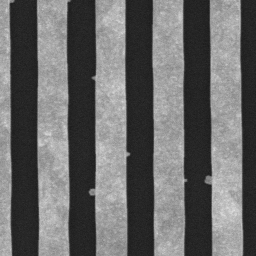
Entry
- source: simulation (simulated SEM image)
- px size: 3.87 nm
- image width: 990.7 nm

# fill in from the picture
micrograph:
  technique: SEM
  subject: wiring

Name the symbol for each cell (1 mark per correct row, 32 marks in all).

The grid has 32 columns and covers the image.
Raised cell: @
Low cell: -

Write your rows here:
@----@@@----@@@@---@@@@---@@@@--
@----@@@----@@@@---@@@@---@@@@--
@----@@@----@@@@---@@@@---@@@@--
@----@@@----@@@@---@@@@---@@@@--
@----@@@----@@@@---@@@@---@@@@--
@----@@@----@@@@---@@@@---@@@@--
@----@@@----@@@@---@@@@---@@@@--
@----@@@----@@@@---@@@@---@@@@--
@----@@@----@@@@---@@@@---@@@@--
@----@@@----@@@@---@@@@---@@@@--
@----@@@----@@@@---@@@@---@@@@--
@----@@@----@@@@---@@@@---@@@@--
@----@@@----@@@@---@@@@---@@@@--
@----@@@----@@@@---@@@@---@@@@--
@----@@@----@@@@---@@@@---@@@@--
@----@@@----@@@@---@@@@---@@@@--
@----@@@----@@@@---@@@@---@@@@--
@----@@@----@@@@---@@@@---@@@@--
@----@@@----@@@@---@@@@---@@@@--
@----@@@----@@@@---@@@@---@@@@--
@----@@@----@@@@---@@@@---@@@@--
@----@@@----@@@@---@@@@----@@@--
@----@@@@---@@@@---@@@@----@@@--
@----@@@@---@@@@---@@@@----@@@--
@----@@@@---@@@@---@@@@----@@@--
@----@@@@---@@@@---@@@@----@@@--
@----@@@@---@@@@---@@@@----@@@--
@----@@@----@@@@---@@@@----@@@--
@----@@@----@@@@---@@@@----@@@--
@----@@@----@@@@---@@@@----@@@--
@----@@@@---@@@@---@@@@----@@@--
@----@@@@---@@@@---@@@@----@@@--